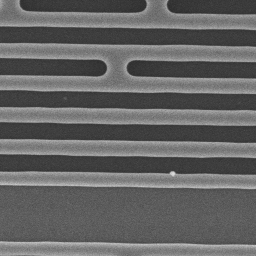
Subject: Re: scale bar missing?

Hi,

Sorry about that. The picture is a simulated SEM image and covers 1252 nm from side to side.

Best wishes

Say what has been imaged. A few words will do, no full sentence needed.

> groups of lines, slits or small figures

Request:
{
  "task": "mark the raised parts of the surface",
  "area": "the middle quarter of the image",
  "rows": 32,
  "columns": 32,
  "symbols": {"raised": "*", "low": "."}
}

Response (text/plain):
...........*****................
...........*****................
..........******................
*************************.......
********************************
********************************
********************************
................................
................................
................................
................................
***************************.....
********************************
********************************
********************************
................................
................................
................................
................................
**************************......
********************************
********************************
********************************
................................
................................
................................
................................
****************************....
********************************
********************************
.................***************
................................